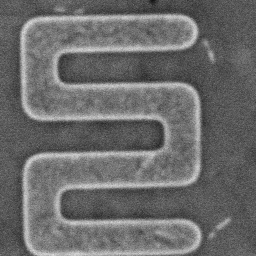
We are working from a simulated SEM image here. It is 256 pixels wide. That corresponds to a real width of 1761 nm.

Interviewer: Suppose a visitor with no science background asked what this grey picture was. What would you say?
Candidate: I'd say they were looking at groups of lines, slits or small figures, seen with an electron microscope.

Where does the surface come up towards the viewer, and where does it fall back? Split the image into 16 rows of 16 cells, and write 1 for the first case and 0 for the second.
0000000000000000
0011111111110000
0111111111110000
0111000000000000
0111000000000000
0111111111110000
0111111111110000
0000000000110000
0000000000110000
0000000001110000
0011111111110000
0111111111100000
0011000000000000
0011000000000000
0011111111110000
0011111111110000